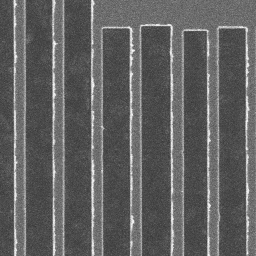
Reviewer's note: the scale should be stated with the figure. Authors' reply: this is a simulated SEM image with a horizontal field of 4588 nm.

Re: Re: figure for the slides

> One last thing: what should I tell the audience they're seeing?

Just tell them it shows parallel lines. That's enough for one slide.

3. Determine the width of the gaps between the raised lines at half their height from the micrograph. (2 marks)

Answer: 27.8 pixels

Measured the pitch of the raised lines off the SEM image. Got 694 nm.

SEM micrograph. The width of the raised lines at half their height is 199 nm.